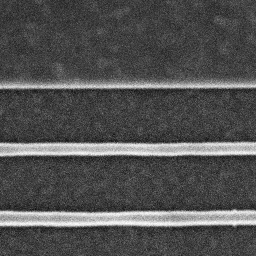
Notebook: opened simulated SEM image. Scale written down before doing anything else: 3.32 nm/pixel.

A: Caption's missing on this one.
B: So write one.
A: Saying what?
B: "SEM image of one or a few lines or trenches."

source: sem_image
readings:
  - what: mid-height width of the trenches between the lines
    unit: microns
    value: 0.19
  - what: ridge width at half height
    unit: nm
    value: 37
